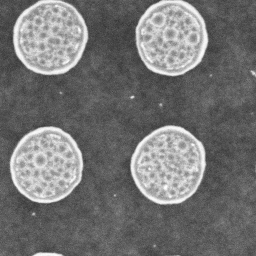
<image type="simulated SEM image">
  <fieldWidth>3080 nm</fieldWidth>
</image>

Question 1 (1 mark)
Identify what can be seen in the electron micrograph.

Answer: raised bodies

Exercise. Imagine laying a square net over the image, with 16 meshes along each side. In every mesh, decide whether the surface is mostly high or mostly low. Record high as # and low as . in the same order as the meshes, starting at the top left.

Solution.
..###....###....
.####....####...
.####....####...
.####....####...
..##......##....
................
................
................
..##.....###....
.####...#####...
.####...#####...
.####....###....
..##......#.....
................
................
................